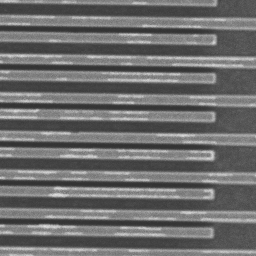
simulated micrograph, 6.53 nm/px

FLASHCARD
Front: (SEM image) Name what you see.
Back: parallel lines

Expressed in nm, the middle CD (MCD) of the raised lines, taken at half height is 74.3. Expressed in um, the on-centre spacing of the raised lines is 0.124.